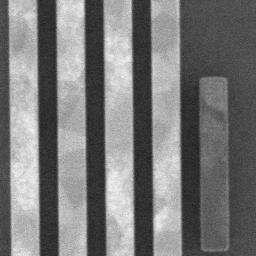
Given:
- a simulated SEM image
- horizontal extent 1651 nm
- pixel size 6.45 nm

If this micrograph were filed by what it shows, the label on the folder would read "groups of lines, slits or small figures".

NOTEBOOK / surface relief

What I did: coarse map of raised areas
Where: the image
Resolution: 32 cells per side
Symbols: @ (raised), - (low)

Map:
-@@@@--@@@---@@@---@@@----------
-@@@@--@@@---@@@---@@@----------
-@@@@--@@@---@@@---@@@----------
-@@@@--@@@---@@@---@@@----------
-@@@@--@@@---@@@---@@@----------
-@@@@--@@@---@@@---@@@----------
-@@@@--@@@---@@@---@@@----------
-@@@@--@@@---@@@---@@@----------
-@@@@--@@@---@@@---@@@----------
-@@@@--@@@---@@@---@@@----------
-@@@@--@@@---@@@---@@@---@@@----
-@@@@--@@@@--@@@---@@@---@@@----
-@@@@--@@@@--@@@@--@@@---@@@----
-@@@@--@@@@--@@@@--@@@---@@@----
-@@@@--@@@@--@@@@--@@@---@@@----
-@@@@--@@@@--@@@@--@@@---@@@----
-@@@@--@@@@--@@@@--@@@---@@@----
-@@@@--@@@@--@@@@--@@@---@@@----
-@@@@--@@@@--@@@@--@@@---@@@----
-@@@@--@@@@--@@@@--@@@---@@@----
-@@@@--@@@@--@@@@--@@@---@@@----
-@@@@--@@@@--@@@@--@@@---@@@----
-@@@@--@@@@--@@@@--@@@---@@@----
-@@@@--@@@@--@@@@--@@@---@@@----
--@@@--@@@@--@@@@--@@@@--@@@----
--@@@--@@@@--@@@@--@@@@--@@@----
--@@@--@@@@--@@@@--@@@@--@@@----
--@@@--@@@@--@@@@--@@@@--@@@----
--@@@--@@@@--@@@@--@@@@--@@@----
--@@@--@@@@--@@@@--@@@@--@@@----
--@@@--@@@@--@@@@--@@@@--@@@----
--@@@--@@@@--@@@@--@@@@---------